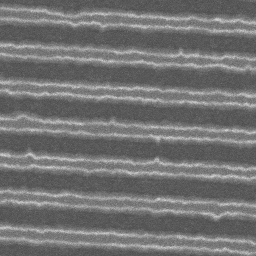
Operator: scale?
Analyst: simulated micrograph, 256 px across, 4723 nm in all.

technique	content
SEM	parallel lines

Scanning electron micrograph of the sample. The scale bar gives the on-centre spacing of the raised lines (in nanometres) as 674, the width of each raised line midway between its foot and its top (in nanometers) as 267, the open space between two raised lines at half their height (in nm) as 408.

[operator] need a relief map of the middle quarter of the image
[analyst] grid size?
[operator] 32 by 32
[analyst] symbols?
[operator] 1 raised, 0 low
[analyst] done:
00000000000000000000001111101111
00000000000000000000000000000000
00000000000000000000000000000000
00000000000000000000000000000000
00000000000000000000000000000000
11111111111101000000000000000000
11111111111111111111111111111110
11111111111111111111111111111111
00111111111111111111111111111111
00000000000000000000111111111111
00000000000000000000000000000000
00000000000000000000000000000000
00000000000000000000000000000000
00000000000000000000000000000000
11111101110110000000000000000000
11111111111111111111111101111000
11111111111111111111111111111111
00111111111111111111111111111111
00000000000000100011001111111111
00000000000000000000000000000000
00000000000000000000000000000000
00000000000000000000000000000000
00000000000000000000000000000000
11111000000000000000000100000000
11111111111111111111111111000110
11111111111111111111111111111111
01111111111111111111111111111111
00000000000000011111111111111111
00000000000000000000000000000000
00000000000000000000000000000000
00000000000000000000000000000000
00000000000000000000000000000000